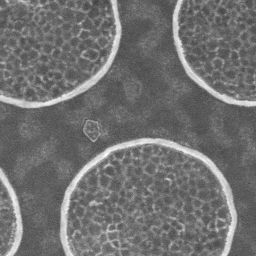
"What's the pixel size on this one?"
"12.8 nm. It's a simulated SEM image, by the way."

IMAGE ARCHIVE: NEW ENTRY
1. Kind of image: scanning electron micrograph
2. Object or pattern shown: raised bodies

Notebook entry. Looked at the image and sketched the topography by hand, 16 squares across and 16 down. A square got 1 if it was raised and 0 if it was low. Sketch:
1111111000011111
1111111000011111
1111111000011111
1111111000011111
1111110000001111
1111100000000111
0010000000000000
0000000000000000
0000000000000000
0000000111110000
0000011111111000
0000011111111100
1000111111111100
1000111111111110
1000111111111100
1000111111111100